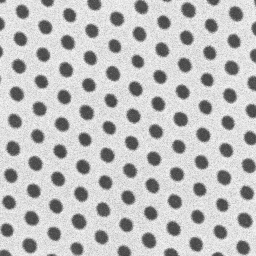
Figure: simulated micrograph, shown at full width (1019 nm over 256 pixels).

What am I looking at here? a regular array of holes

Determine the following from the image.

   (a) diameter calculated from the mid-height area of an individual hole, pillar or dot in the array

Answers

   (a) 59.4 nm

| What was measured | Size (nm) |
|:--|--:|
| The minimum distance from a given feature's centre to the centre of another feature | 108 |